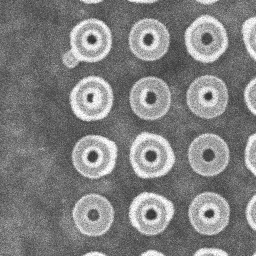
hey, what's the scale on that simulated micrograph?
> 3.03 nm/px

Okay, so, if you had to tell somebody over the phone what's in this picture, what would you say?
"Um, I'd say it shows a regular array of ring-shaped raised bodies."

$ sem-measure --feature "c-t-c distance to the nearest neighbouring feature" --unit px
57.2